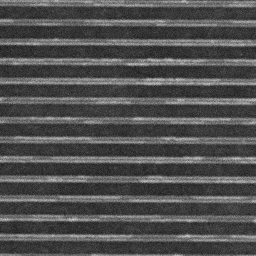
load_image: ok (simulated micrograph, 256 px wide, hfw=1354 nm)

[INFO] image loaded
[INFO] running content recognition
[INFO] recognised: parallel lines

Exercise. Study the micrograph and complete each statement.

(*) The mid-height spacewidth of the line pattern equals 76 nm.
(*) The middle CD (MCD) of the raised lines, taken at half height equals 29.1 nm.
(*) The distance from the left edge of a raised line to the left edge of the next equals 103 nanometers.